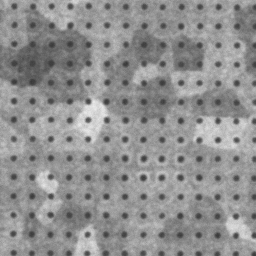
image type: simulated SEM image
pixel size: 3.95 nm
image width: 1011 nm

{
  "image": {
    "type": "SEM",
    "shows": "a regular array of holes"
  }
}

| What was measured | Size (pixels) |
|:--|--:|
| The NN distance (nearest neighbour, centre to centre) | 18.4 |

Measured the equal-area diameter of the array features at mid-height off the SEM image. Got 27.7 nanometers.